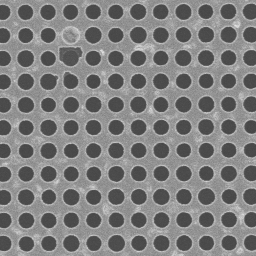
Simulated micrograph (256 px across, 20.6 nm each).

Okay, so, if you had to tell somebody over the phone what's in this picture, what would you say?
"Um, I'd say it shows a regular array of holes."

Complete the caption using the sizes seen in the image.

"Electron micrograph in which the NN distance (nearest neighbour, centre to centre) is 463 nanometres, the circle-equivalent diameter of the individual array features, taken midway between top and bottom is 321 nanometres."